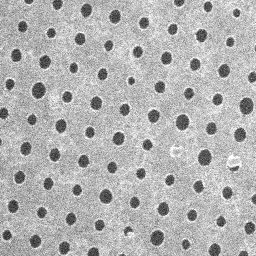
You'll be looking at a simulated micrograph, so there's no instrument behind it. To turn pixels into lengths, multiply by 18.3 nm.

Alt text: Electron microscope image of a regular array of holes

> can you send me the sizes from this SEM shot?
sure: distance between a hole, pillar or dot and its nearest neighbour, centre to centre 536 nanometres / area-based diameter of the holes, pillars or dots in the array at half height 0.23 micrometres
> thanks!